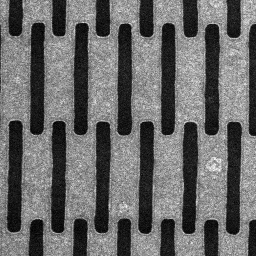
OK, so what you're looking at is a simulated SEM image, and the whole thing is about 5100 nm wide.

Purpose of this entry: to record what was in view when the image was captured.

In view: a regular array of holes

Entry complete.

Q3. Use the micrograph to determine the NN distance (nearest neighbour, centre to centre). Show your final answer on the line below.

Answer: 869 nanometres